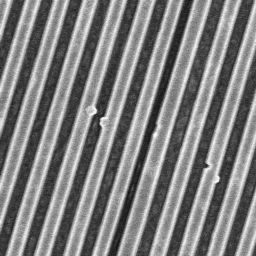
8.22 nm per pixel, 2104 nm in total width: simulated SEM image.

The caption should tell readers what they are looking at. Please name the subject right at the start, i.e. parallel lines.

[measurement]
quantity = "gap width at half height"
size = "13.9 pixels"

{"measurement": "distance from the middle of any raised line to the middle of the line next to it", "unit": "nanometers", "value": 226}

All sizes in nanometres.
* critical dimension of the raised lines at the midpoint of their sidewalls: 115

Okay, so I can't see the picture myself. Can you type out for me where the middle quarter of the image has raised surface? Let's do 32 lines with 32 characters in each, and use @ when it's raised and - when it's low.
@@@----@@@@---@@@@---@@@@---@@@@
@@@----@@@----@@@----@@@@--@@@@-
@@@---@@@@---@@@@----@@@---@@@@-
@@----@@@@---@@@@---@@@@---@@@@-
@@----@@@----@@@----@@@@--@@@@--
@@---@@@@----@@@----@@@---@@@@--
@----@@@@---@@@@---@@@@---@@@@--
@----@@@----@@@----@@@@--@@@@@--
@----@@@----@@@----@@@---@@@@---
@---@@@@---@@@@----@@@---@@@@---
----@@@@---@@@@---@@@@---@@@@---
----@@@@---@@@----@@@@--@@@@----
----@@@@---@@@----@@@---@@@@----
---@@@@--@@@@@----@@@--@@@@@----
---@@@---@@@@----@@@@--@@@@-----
--@@@@---@@@@----@@@---@@@@----@
--@@@@---@@@@----@@@---@@@@----@
--@@@----@@@----@@@@--@@@@@----@
--@@@----@@@----@@@---@@@@----@@
-@@@@----@@@----@@@---@@@@----@@
-@@@@---@@@@----@@@---@@@@----@@
-@@@----@@@----@@@@--@@@@----@@@
@@@@----@@@----@@@@--@@@@----@@@
@@@@---@@@@----@@@---@@@@----@@@
@@@----@@@----@@@@--@@@@----@@@@
@@@----@@@----@@@---@@@@----@@@@
@@@---@@@@----@@@---@@@@----@@@-
@@----@@@@---@@@@--@@@@@----@@@-
@@----@@@----@@@@--@@@@----@@@@-
@@----@@@----@@@---@@@@----@@@@-
@@---@@@@----@@@--@@@@@----@@@--
@----@@@@---@@@@--@@@@----@@@@--